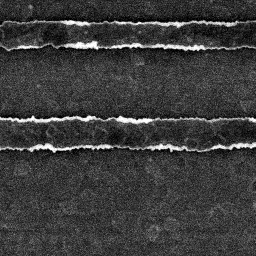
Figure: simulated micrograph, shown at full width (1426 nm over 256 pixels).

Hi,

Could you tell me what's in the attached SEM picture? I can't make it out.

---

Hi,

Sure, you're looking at one or a few lines or trenches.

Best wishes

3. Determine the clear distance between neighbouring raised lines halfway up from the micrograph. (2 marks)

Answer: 393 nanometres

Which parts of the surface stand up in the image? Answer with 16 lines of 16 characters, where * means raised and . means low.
................
****************
****************
................
................
................
................
****************
****************
................
................
................
................
................
................
................